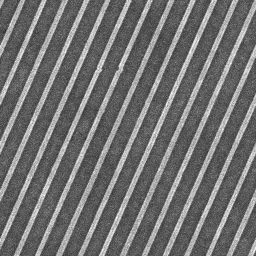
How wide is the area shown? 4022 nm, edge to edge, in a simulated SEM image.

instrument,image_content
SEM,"parallel lines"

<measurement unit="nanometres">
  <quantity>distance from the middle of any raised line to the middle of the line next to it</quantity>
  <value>306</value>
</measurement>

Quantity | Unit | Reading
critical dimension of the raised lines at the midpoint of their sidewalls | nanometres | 59.3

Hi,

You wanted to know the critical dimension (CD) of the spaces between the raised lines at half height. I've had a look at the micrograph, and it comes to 0.237 micrometres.